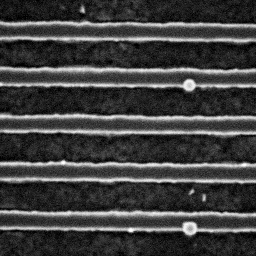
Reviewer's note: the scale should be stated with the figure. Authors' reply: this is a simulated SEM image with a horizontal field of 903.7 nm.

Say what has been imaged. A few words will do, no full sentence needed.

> lines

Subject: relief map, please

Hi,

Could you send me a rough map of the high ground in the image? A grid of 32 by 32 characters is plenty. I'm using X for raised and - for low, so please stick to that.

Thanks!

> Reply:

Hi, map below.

--------------------------------
--------------------------------
--------------------------------
XXXXXXXXXXXXXXXXXXXXXXXXXXXXXXXX
XXXXXXXXXXXXXXXXXXXXXXXXXXXXXXXX
--------------------------------
--------------------------------
--------------------------------
XX---X--------------------------
XXXXXXXXXXXXXXXXXXXXXXXXXXXXXXXX
XXXXXXXXXXXXXXXXXXXXXXXXXXXXXXXX
--------------------------------
--------------------------------
--------------------------------
XX-XXXXXXXXX--XXXX--------------
XXXXXXXXXXXXXXXXXXXXXXXXXXXXXXXX
XXXX-XXXXXXXXXXXXXXXXXXXXXXXXXXX
--------------------------------
--------------------------------
--------------------------------
XXXXXXXXXXXXXXXXX-XXXX---XX---XX
XXXXXXXXXXXXXXXXXXXXXXXXXXXXXXXX
XX---XXXXXXXXXXXXXXXXXXXXXXXXXXX
--------------------------------
--------------------------------
--------------------------------
XXXXX---X----XX-----------------
XXXXXXXXXXXXXXXXXXXXXXXXXXXXXXXX
XXXXXXXXXXXXXXXXXXXXXXXXXXXXXXXX
--------------------------------
--------------------------------
--------------------------------